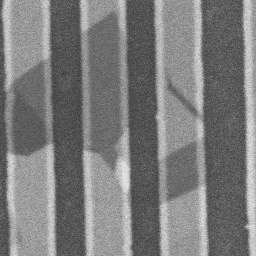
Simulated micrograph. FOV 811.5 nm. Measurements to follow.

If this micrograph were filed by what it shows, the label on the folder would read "one or a few lines or trenches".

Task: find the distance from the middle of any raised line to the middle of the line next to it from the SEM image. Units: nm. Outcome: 240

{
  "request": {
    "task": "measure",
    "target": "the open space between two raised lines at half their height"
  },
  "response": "118 nanometers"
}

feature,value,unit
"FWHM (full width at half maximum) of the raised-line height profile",124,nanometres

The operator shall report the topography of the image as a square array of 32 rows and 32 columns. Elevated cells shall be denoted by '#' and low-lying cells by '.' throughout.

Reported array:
.#####.....####.....#####......#
.#####....#####.....#####......#
.#####.....####.....#####......#
.#####.....####.....#####......#
.#####.....####.....#####......#
.#####.....####.....#####......#
.#####.....####.....#####......#
.#####.....####.....#####......#
.#####.....####.....#####......#
.#####.....####.....#####......#
.#####.....####.....#####......#
.#####.....#####....#####......#
.#####.....#####....#####......#
.#####.....#####....#####......#
.#####.....#####....#####......#
.#####.....#####....#####......#
.#####.....#####....#####......#
.#####.....#####....#####......#
.#####.....#####....#####......#
.#####.....#####....#####......#
.#####.....#####....#####......#
.#####.....#####....#####......#
.#####.....#####....#####......#
.#####.....#####....#####......#
.#####.....#####....#####......#
.#####.....#####....#####......#
.#####.....#####....#####......#
..####.....#####....#####.......
..####.....#####....#####......#
..####.....#####.....####.......
..####.....#####.....####.......
..#####....#####.....####.......